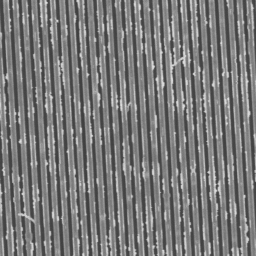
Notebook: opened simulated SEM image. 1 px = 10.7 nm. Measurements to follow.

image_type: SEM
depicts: parallel lines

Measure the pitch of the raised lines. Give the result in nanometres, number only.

100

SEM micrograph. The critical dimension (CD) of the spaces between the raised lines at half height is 0.0415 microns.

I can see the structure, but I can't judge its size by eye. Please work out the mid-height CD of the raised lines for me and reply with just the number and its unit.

61.6 nanometers